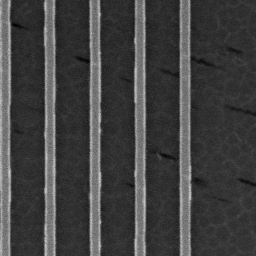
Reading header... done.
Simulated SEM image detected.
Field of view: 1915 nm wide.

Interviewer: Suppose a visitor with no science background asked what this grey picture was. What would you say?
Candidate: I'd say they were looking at parallel lines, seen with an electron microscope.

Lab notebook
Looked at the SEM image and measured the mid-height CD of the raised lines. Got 65.5 nm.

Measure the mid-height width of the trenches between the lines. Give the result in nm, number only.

268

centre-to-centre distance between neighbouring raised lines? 0.337 um